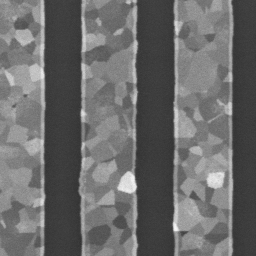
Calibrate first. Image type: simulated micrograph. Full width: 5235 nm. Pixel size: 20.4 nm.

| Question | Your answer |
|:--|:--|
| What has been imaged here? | one or a few lines or trenches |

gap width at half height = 828 nm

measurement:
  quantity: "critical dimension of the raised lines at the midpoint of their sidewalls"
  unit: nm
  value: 1100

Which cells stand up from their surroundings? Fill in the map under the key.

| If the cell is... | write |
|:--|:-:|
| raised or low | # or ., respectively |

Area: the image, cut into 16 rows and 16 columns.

###..###...###..
###..###...###..
###..###...###..
###..###...###..
###..###...###..
###..###...###..
###..###...###..
###..###...###..
###..###...###..
###..###...###..
###..###...###..
###..###...###..
###..###...###..
###..###...###..
###..###...###..
###..###...###..